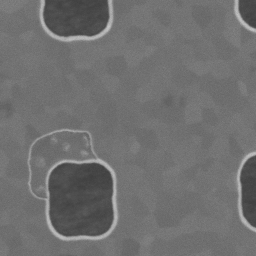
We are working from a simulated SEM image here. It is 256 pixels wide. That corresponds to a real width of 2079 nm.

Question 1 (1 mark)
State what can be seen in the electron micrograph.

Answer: holes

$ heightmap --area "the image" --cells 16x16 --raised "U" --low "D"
UUUDDDDUUUUUUUUD
UUUDDDDUUUUUUUUD
UUUUUUUUUUUUUUUU
UUUUUUUUUUUUUUUU
UUUUUUUUUUUUUUUU
UUUUUUUUUUUUUUUU
UUUUUUUUUUUUUUUU
UUUUUUUUUUUUUUUU
UUUUUUUUUUUUUUUU
UUUUUUUUUUUUUUUU
UUUDDDDUUUUUUUUD
UUUDDDDUUUUUUUUD
UUUDDDDUUUUUUUUD
UUUDDDDUUUUUUUUD
UUUDDDDUUUUUUUUU
UUUUUUUUUUUUUUUU